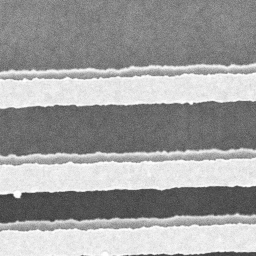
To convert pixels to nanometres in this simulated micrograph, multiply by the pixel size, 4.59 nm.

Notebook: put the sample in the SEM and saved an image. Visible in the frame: lines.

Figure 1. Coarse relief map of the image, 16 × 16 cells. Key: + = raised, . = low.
................
................
................
................
..++++++++++++++
++++++++++++++++
++++++++........
................
................
............++++
++++++++++++++++
++++++++++++++++
................
..............+.
++++++++++++++++
++++++++++++++++